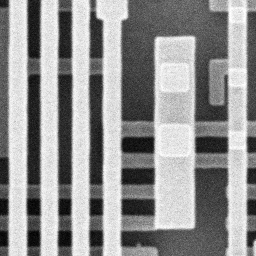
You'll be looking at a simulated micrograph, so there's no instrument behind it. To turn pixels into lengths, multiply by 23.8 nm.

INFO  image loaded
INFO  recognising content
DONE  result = wiring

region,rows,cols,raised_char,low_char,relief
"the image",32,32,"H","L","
LHHLLHHLLHHLHHHHLLLLLLLLLLLLLHHL
LHHLLHHLLHHLHHHHLLLLLLLLLLLLLHHL
LHHLLHHLLHHLLHHLLLLLLLLLLLLLLHHL
LHHLLHHLLHHLLHHLLLLLLLLLLLLLLHHL
LHHLLHHLLHHLLHHLLLLLLLLLLLLLLHHL
LHHLLHHLLHHLLHHLLLLHHHHHLLLLLHHL
LHHLLHHLLHHLLHHLLLLHHHHHLLLLLHHL
LHHLLHHLLHHLLHHLLLLHHHHHLLLLLHHL
LHHLLHHLLHHLLHHLLLLHHHHHLLLLLHHL
LHHLLHHLLHHLLHHLLLLHHHHHLLLLLHHL
LHHLLHHLLHHLLHHLLLLHHHHHLLLLLHHL
LHHLLHHLLHHLLHHLLLLHHHHHLLLLLHHL
LHHLLHHLLHHLLHHLLLLHHHHHLLLLLHHL
LHHLLHHLLHHLLHHLLLLHHHHHLLLLLHHL
LHHLLHHLLHHLLHHLLLLHHHHHLLLLLHHL
LHHLLHHLLHHLLHHLLLLHHHHHLLLLLHHL
LHHLLHHLLHHLLHHLLLLHHHHHLLLLLHHL
LHHLLHHLLHHLLHHLLLLHHHHHLLLLLHHL
LHHLLHHLLHHLLHHLLLLHHHHHLLLLLHHL
LHHLLHHLLHHLLHHLLLLHHHHHLLLLLHHL
LHHLLHHLLHHLLHHLLLLHHHHHLLLLLHHL
LHHLLHHLLHHLLHHLLLLHHHHHLLLLLHHL
LHHLLHHLLHHLLHHLLLLHHHHHLLLLLHHL
LHHLLHHLLHHLLHHLLLLHHHHHLLLLLHHL
LHHLLHHLLHHLLHHLLLLHHHHHLLLLLHHL
LHHLLHHLLHHLLHHLLLLHHHHHLLLLLHHL
LHHLLHHLLHHLLHHLLLLHHHHHLLLLLHHL
LHHLLHHLLHHLLHHLLLLHHHHHLLLLLHHL
LHHLLHHLLHHLLHHLLLLLHHHHLLLLLHHL
LHHLLHHLLHHLLHHLLLLLLLLLLLLLLHHL
LHHLLHHLLHHLLHHLLLLLLLLLLLLLLHHL
LHHLLHHLLHHLLHHLLLLLLLLLLLLLLHHL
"